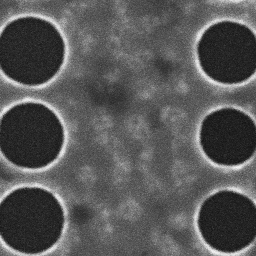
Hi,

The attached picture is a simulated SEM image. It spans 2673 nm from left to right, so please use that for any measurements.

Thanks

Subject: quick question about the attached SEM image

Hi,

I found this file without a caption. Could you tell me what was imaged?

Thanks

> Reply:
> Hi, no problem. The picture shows holes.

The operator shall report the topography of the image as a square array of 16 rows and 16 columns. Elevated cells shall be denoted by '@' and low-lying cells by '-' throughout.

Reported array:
@@@@@@@@@@@@@@@@
@--@@@@@@@@@@--@
----@@@@@@@@----
----@@@@@@@@----
----@@@@@@@@@---
@@@@@@@@@@@@@@@@
@--@@@@@@@@@@@@@
----@@@@@@@@@---
----@@@@@@@@----
----@@@@@@@@@---
@@@@@@@@@@@@@@@@
@@@@@@@@@@@@@@@@
----@@@@@@@@@---
----@@@@@@@@----
----@@@@@@@@----
@--@@@@@@@@@@--@